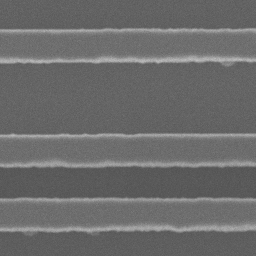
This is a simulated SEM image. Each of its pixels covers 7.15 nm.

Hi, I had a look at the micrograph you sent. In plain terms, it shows lines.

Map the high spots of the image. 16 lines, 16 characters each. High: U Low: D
DDDDDDDDDDDDDDDD
DDDDDDDDDDDDDDDD
UUUUUUUUUUUUUUUU
UUUUUUUUUUUUUUUU
DDDDDDDDDDDDDDDD
DDDDDDDDDDDDDDDD
DDDDDDDDDDDDDDDD
DDDDDDDDDDDDDDDD
UUUUUUUUUUUUUUUU
UUUUUUUUUUUUUUUU
DDDDDDDDDDDDDDDD
DDDDDDDDDDDDDDDD
UUUUUUUUUUUUUUUU
UUUUUUUUUUUUUUUU
DDDDDDDDDDDDDDDD
DDDDDDDDDDDDDDDD